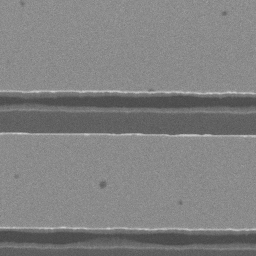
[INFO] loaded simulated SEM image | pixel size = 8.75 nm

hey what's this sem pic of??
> lines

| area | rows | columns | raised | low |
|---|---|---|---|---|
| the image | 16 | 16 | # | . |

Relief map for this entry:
################
################
################
################
################
################
................
................
################
################
################
################
################
################
................
................